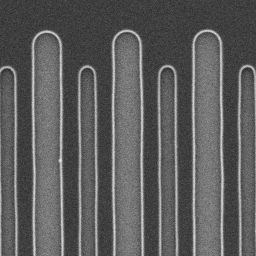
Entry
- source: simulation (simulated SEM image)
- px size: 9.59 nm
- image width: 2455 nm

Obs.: groups of lines, slits or small figures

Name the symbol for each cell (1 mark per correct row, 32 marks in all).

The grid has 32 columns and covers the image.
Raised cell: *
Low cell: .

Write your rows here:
********************************
********************************
********************************
********************************
*****..********..********..*****
****...*******...*******....****
****....******....******....****
****....******....******....****
****....******....******....****
..**....**..**....**..**....**..
..**....**..**....**..**....**..
..**....**..**....**..**....**..
..**....**..**....**..**....**..
..**....**..**....**..**....**..
..**....**..**....**..**....**..
..**....**..**....**..**....**..
..**....**..**....**..**....**..
..**....**..**....**..**....**..
..**....**..**....**..**....**..
..**....**..**....**..**....**..
..**....**..**....**..**....**..
..**....**..**....**..**....**..
..**....**..**....**..**....**..
..**....**..**....**..**....**..
..**....**..**....**..**....**..
..**....**..**....**..**....**..
..**....**..**....**..**....**..
..**....**..**....**..**....**..
..**....**..**....**..**....**..
..**....**..**....**..**....**..
..**....**..**....**..**....**..
..**....**..**....**..**....**..